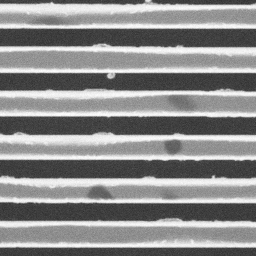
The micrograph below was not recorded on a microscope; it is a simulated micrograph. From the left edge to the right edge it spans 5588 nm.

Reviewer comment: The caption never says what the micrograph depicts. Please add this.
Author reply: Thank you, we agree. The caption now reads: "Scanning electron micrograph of lines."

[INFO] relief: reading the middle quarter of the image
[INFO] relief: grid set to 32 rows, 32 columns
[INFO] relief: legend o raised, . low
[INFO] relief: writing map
oooooooooooooooooooooooooooooooo
oooooooooooooooooooooooooooooooo
................................
................................
................................
................................
................................
oooooooooooooooooooooooooooooooo
oooooooooooooooooooooooooooooooo
oooooooooooooooooooooooooooooooo
oooooooooooooooooooooooooooooooo
oooooooooooooooooooooooooooooooo
oooooooooooooooooooooooooooooooo
................................
................................
................................
................................
................................
........oooooooooooooooooooooooo
oooooooooooooooooooooooooooooooo
oooooooooooooooooooooooooooooooo
oooooooooooooooooooooooooooooooo
oooooooooooooooooooooooooooooooo
oooooooooooooooooooooooooooooooo
................................
................................
................................
................................
................................
oooooooooooooooooooooooooooooooo
oooooooooooooooooooooooooooooooo
oooooooooooooooooooooooooooooooo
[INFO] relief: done